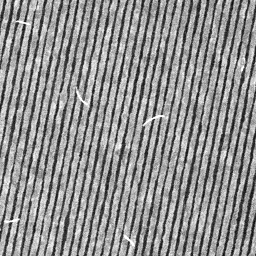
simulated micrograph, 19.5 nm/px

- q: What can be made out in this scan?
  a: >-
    parallel lines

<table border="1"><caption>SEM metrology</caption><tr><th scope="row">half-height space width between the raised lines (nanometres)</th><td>64.7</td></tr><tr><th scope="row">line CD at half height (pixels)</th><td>4.78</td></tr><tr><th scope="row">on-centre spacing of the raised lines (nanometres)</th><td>156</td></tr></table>